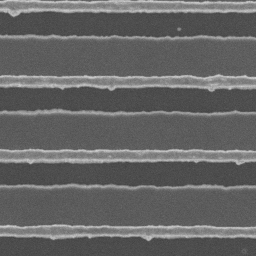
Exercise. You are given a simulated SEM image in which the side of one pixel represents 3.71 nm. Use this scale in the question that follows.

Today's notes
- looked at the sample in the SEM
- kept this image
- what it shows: lines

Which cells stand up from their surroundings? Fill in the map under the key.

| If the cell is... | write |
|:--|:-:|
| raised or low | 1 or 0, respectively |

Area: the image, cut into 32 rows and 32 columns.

11111111111111111111111111111111
01100000000000000000000000000000
00000000000000000000000000000000
00000000000000000000000000000000
00000000000000000000000000000000
11111111111111111111111111111111
11111111111111111111111111111111
11111111111111111111111111111111
11111111111111111111111111111111
11111111111111111111111111111111
11111111111111111111111111111111
00000000000000000000000000000000
00000000000000000000000000000000
00000000000000000000000000000000
11111111111111111111111111111111
11111111111111111111111111111111
11111111111111111111111111111111
11111111111111111111111111111111
11111111111111111111111111111111
11111111111111111111111111111111
00000000000000000000000000000000
00000000000000000000000000000000
00000000000000000000000000000000
11111111111111111111111111111111
11111111111111111111111111111111
11111111111111111111111111111111
11111111111111111111111111111111
11111111111111111111111111111111
11111111111111111111111111111111
11111111111111111111111111111111
00000000000000000000000000000000
00000000000000000000000000000000